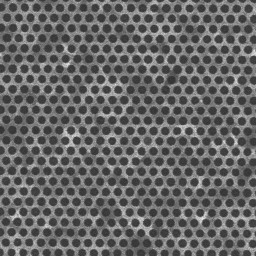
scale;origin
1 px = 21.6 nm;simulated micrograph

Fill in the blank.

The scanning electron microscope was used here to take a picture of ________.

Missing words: a regular array of holes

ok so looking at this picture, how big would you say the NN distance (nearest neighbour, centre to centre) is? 0.246 micrometres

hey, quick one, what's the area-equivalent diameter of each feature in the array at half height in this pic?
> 193 nanometers